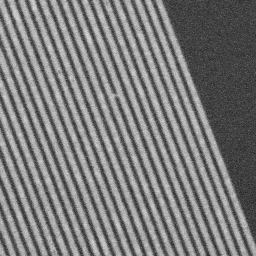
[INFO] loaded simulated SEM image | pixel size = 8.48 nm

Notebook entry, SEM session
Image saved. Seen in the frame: parallel lines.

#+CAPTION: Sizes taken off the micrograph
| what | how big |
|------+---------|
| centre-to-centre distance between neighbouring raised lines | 83.6 nm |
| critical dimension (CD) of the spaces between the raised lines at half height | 34.7 nanometers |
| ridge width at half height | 0.0495 micrometres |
